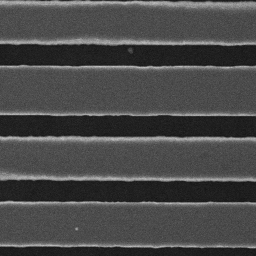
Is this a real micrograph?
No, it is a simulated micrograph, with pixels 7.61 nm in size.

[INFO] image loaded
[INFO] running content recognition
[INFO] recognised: lines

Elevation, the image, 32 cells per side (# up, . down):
################################
################################
################################
################################
################################
.##..###....####################
................................
................................
################################
################################
################################
################################
################################
################################
................................
................................
................................
################################
################################
################################
################################
################################
......##########################
................................
................................
################################
################################
################################
################################
################################
################################
................................